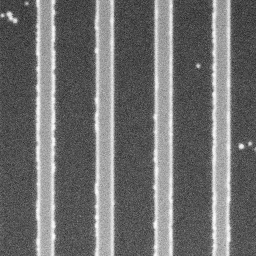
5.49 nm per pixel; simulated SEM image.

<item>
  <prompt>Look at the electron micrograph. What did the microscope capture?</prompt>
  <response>lines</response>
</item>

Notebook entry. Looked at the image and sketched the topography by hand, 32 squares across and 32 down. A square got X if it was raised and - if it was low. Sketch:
-----XX-----XX-----XX------XX---
-----XX-----XX-----XX------XX---
-----XX-----XX-----XX------XX---
-----XX-----XX-----XX------XX---
-----XX-----XX-----XX------XX---
-----XX-----XX-----XX------XX---
-----XX-----XX-----XX------XX---
-----XX-----XX-----XX------XX---
-----XX-----XX-----XX------XX---
-----XX-----XX-----XX------XX---
-----XX-----XX-----XX------XX---
-----XX-----XX-----XX------XX---
-----XX-----XX-----XX------XX---
-----XX-----XX-----XX------XX---
-----XX-----XX-----XX------XX---
-----XX-----XX-----XX------XX---
-----XX-----XX-----XX------XX---
-----XX-----XX-----XX------XX---
-----XX-----XX-----XX------XX---
-----XX-----XX-----XX------XX---
-----XX-----XX-----XX------XX---
-----XX-----XX-----XX------XX---
-----XX-----XX-----XX------XX---
-----XX-----XX-----XX------XX---
-----XX-----XX-----XX------XX---
-----XX-----XX-----XX------XX---
-----XX-----XX-----XX------XX---
-----XX-----XX-----XX------XX---
-----XX-----XX-----XX------XX---
-----XX-----XX-----XX------XX---
-----XX-----XX-----XX------XX---
-----XX-----XX-----XX------XX---